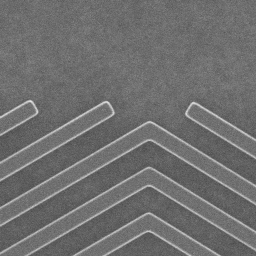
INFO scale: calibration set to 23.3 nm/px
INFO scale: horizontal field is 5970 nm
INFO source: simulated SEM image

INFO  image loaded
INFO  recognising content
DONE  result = groups of lines, slits or small figures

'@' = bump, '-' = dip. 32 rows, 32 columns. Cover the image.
--------------------------------
--------------------------------
--------------------------------
--------------------------------
--------------------------------
--------------------------------
--------------------------------
--------------------------------
--------------------------------
--------------------------------
--------------------------------
--------------------------------
--------------------------------
--@@--------@@----------@@------
@@@@------@@@@----------@@@-----
@@------@@@@------@------@@@@---
@------@@@------@@@@@------@@@--
-----@@@@------@@@@@@@@-----@@@@
---@@@@------@@@@----@@@------@@
-@@@@------@@@@-------@@@@-----@
@@@@-----@@@@-----------@@@@----
@@------@@@@-----@@@-----@@@@---
------@@@@------@@@@@------@@@@-
----@@@@------@@@@-@@@@------@@@
---@@@------@@@@-----@@@@-----@@
-@@@@------@@@---------@@@------
@@@------@@@@-----------@@@@----
@------@@@@------@@@------@@@@--
-----@@@@------@@@@@@@-----@@@@-
----@@@@-----@@@@---@@@@-----@@@
--@@@@------@@@@-----@@@@------@
@@@@------@@@@---------@@@@-----